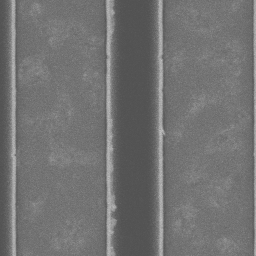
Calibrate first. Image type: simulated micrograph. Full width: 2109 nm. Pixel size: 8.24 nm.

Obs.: one or a few lines or trenches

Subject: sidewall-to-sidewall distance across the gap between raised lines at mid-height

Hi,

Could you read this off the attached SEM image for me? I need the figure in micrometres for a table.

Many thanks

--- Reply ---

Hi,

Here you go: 0.774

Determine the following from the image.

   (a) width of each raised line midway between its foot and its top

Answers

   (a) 435 nm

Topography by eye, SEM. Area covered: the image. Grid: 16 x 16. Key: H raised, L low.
HLLLLLLHHHLLLLLL
HLLLLLLHHHLLLLLL
HLLLLLLHHHLLLLLL
HLLLLLLHHHLLLLLL
HLLLLLLHHHLLLLLL
HLLLLLLHHHLLLLLL
HLLLLLLHHHLLLLLL
HLLLLLLHHHLLLLLL
HLLLLLLHHHLLLLLL
HLLLLLLHHHLLLLLL
HLLLLLLHHHLLLLLL
HLLLLLLHHHLLLLLL
HLLLLLLHHHLLLLLL
HLLLLLLHHHLLLLLL
HLLLLLLHHHLLLLLL
HLLLLLLHHHLLLLLL